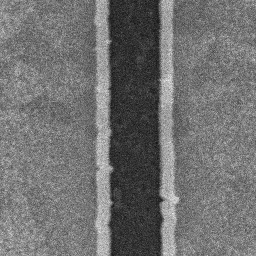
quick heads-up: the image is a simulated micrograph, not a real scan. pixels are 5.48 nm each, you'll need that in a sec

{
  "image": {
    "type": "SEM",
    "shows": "one or a few lines or trenches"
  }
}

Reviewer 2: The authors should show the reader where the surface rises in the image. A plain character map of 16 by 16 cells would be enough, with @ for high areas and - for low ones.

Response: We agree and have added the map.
@@@@@@----@@@@@@
@@@@@@----@@@@@@
@@@@@@----@@@@@@
@@@@@@----@@@@@@
@@@@@@----@@@@@@
@@@@@@----@@@@@@
@@@@@@----@@@@@@
@@@@@@----@@@@@@
@@@@@@----@@@@@@
@@@@@@----@@@@@@
@@@@@@-----@@@@@
@@@@@@-----@@@@@
@@@@@@-----@@@@@
@@@@@@-----@@@@@
@@@@@@----@@@@@@
@@@@@@-----@@@@@